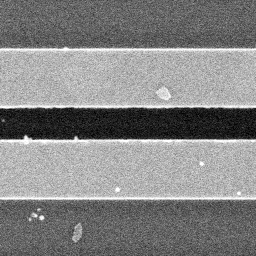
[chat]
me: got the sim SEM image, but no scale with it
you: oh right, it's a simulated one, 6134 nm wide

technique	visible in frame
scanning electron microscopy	lines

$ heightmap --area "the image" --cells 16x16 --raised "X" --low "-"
----------------
----------------
----------------
XXXXXXXXXXXXXXXX
XXXXXXXXXXXXXXXX
XXXXXXXXXXXXXXXX
XXXXXXXXXXXXXXXX
----------------
----------------
XXXXXXXXXXXXXXXX
XXXXXXXXXXXXXXXX
XXXXXXXXXXXXXXXX
----------------
----------------
----------------
----------------